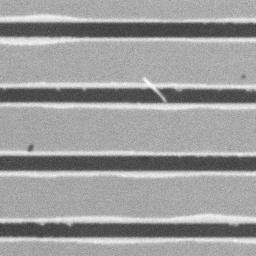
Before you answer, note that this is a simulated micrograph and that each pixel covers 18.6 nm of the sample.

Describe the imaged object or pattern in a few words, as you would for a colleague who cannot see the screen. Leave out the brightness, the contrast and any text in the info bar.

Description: lines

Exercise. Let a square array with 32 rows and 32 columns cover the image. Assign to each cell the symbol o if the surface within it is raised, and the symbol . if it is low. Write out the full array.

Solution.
oooooooooooooooooooooooooooooooo
oooooooooooooooooooooooooooooooo
.........ooooooooooooooooooooooo
................................
................................
oooooooooooooooooooooooooooooooo
oooooooooooooooooooooooooooooooo
oooooooooooooooooooooooooooooooo
oooooooooooooooooooooooooooooooo
oooooooooooooooooooooooooooooooo
oooooooooooooooooooooooooooooooo
................................
................................
oooooooooooooooooooooooooooooooo
oooooooooooooooooooooooooooooooo
oooooooooooooooooooooooooooooooo
oooooooooooooooooooooooooooooooo
oooooooooooooooooooooooooooooooo
oooooooooooooooooooooooooooooooo
................................
................................
................................
oooooooooooooooooooooooooooooooo
oooooooooooooooooooooooooooooooo
oooooooooooooooooooooooooooooooo
oooooooooooooooooooooooooooooooo
oooooooooooooooooooooooooooooooo
oooooooo.......oooooooo........o
................................
................................
oooooooooooooooooooooooooooooooo
oooooooooooooooooooooooooooooooo